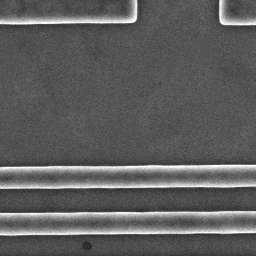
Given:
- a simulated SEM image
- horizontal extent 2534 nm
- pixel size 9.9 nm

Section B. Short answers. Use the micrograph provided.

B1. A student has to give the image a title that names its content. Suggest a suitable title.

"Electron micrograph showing wiring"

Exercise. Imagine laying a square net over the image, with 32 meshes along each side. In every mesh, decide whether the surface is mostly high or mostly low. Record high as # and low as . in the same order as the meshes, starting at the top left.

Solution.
#################...........####
#################...........####
#################...........####
................................
................................
................................
................................
................................
................................
................................
................................
................................
................................
................................
................................
................................
................................
................................
................................
................................
................................
################################
################################
................................
................................
................................
................................
################################
################################
................................
................................
................................